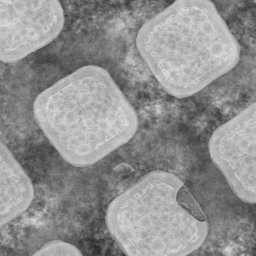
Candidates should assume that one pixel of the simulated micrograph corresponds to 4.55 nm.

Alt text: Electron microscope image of raised bodies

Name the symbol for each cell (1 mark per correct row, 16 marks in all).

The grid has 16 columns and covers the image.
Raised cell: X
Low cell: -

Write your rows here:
XXXX------XXX---
XXXX-----XXXXX--
XXX------XXXXXX-
XX-------XXXXXX-
-----XX---XXXX--
---XXXX---XXX---
--XXXXXX--------
--XXXXXXX-----XX
---XXXXX-----XXX
X---XXX------XXX
X-------------XX
XX------XXX---XX
XX-----XXXX----X
X------XXXXX----
-------XXXXXX---
---XX---XXXX----